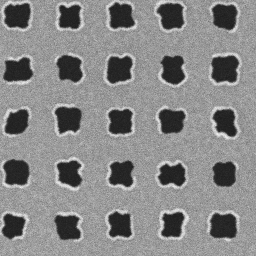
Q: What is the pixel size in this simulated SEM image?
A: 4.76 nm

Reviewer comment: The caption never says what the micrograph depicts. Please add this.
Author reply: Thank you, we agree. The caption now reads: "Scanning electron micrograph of a regular array of holes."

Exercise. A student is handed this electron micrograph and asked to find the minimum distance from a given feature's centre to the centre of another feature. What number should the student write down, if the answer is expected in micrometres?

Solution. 0.243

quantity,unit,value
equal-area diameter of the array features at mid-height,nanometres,124